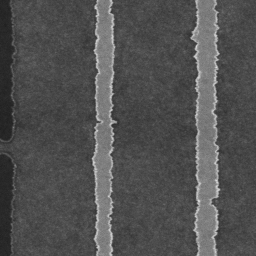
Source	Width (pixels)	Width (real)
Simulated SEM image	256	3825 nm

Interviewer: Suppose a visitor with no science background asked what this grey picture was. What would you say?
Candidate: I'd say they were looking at one or a few lines or trenches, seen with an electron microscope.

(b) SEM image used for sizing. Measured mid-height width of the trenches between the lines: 1.25 microns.